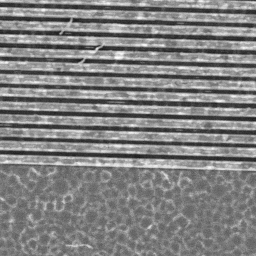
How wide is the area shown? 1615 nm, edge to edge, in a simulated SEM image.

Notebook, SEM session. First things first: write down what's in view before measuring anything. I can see parallel lines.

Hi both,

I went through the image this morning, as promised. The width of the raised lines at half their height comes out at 48.9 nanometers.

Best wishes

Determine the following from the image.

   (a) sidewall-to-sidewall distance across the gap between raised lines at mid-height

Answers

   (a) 36.3 nm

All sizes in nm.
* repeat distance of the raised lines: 84.5